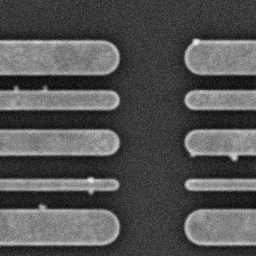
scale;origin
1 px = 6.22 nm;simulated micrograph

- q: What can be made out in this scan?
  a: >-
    groups of lines, slits or small figures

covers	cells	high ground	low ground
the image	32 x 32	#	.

................................
................................
................................
................................
................................
##############..........########
###############........#########
###############........#########
##############..........########
................................
................................
##############..........########
###############........#########
##############..........########
................................
................................
##############..........########
###############........#########
###############........#########
................................
................................
................................
##############..........########
###############.........########
................................
................................
##############..........########
###############........#########
###############........#########
###############........#########
#############............#######
................................